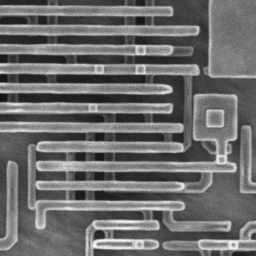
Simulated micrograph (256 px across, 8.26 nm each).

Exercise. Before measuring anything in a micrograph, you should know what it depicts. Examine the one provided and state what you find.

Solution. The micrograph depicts wiring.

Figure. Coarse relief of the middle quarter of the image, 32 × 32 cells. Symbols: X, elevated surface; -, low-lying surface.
XXXXXXXXXXXXXXXXXXXXXXXXXXXXXXXX
XXXXXXXXXXXXXXXXXXXXXXXXXXXXXXXX
---------XXXXXXXXXXXXXXXXXXXXXXX
--------------------------------
--------------------------------
XXXXXXXXXXXXXXXXXXXXXXXXXX------
XXXXXXXXXXXXXXXXXXXXXXXXXXX-----
----------------XXXXXXXXXX------
--------------------------------
--------------------------------
XXXXXXXXXXXXXXXXXXXXXXXXXXX-----
XXXXXXXXXXXXXXXXXXXXXXXXXXX-----
--------------------------------
--------------------------------
--------------------------------
XXXXXXXXXXXXXXXXXXXXXXXXXXXXXX--
XXXXXXXXXXXXXXXXXXXXXXXXXXXXXX--
--------------------------------
--------------------------------
XXXXXXX-XX----------------------
XXXXXXXXXXXXXXXXXXXXXXXXXXXXXX--
XXXXXXXXXXXXXXXXXXXXXXXXXXXXXX--
--------------------------------
--------------------------------
-------XX-----------------------
XXXXXXXXXXXXXXXXXXXXXXXXXXXXXXXX
XXXXXXXXXXXXXXXXXXXXXXXXXXXXXXXX
--------------------------------
--------------------------------
----XXXXXXXXX-------------------
XXXXXXXXXXXXXXXXXXXXXXXXXXXXXX--
-------XX------XXXXXXXXXXXXXX---